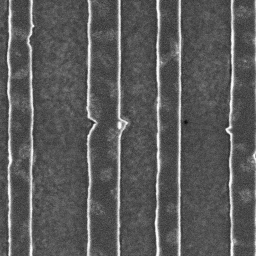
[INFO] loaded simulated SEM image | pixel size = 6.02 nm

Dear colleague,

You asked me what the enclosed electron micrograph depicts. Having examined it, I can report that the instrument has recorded one or a few lines or trenches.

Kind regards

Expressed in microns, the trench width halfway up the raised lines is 0.307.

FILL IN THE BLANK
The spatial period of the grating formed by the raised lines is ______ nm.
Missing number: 447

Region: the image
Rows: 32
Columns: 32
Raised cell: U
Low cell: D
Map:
DUUUDDDDDDDUUUUDDDDDUUDDDDDDDUUU
DUUUDDDDDDDUUUUDDDDDUUDDDDDDDUUU
DUUUDDDDDDDUUUUDDDDDUUDDDDDDDUUU
DUUUDDDDDDDUUUUDDDDDUUUDDDDDDUUU
DUUUDDDDDDDUUUUDDDDDUUUDDDDDDUUU
DUUUDDDDDDDUUUUDDDDDUUUDDDDDDUUU
DUUUDDDDDDDUUUUDDDDDUUUDDDDDDUUU
DUUUDDDDDDDUUUUDDDDDUUUDDDDDDUUU
DUUUDDDDDDDUUUUDDDDDUUUDDDDDDUUU
DUUUDDDDDDDUUUUDDDDDUUUDDDDDDUUU
DUUUDDDDDDDUUUUDDDDDUUUDDDDDDUUU
DUUUDDDDDDDUUUUDDDDDUUUDDDDDDUUU
DUUUDDDDDDDUUUUDDDDDUUUDDDDDDUUU
DUUUDDDDDDDUUUUDDDDDUUUDDDDDDUUU
DUUUDDDDDDDUUUUDDDDDUUUDDDDDDUUU
DUUUDDDDDDDDUUUUDDDDUUUDDDDDDUUU
DUUUDDDDDDDUUUUDDDDDUUUDDDDDUUUU
DUUUDDDDDDDUUUUDDDDDUUUDDDDDDUUU
DUUUDDDDDDDUUUUDDDDDUUUDDDDDDUUU
DUUUDDDDDDDUUUUDDDDDUUDDDDDDDUUU
DUUUDDDDDDDUUUUDDDDDUUDDDDDDDUUU
DUUUDDDDDDDUUUUDDDDDUUDDDDDDDUUU
DUUUDDDDDDDUUUUDDDDDUUDDDDDDDUUU
DUUUDDDDDDDUUUUDDDDDUUUDDDDDDUUU
DUUUDDDDDDDUUUUDDDDDUUUDDDDDDUUU
DUUUDDDDDDDUUUUDDDDDUUDDDDDDDUUU
DUUUDDDDDDDUUUUDDDDDUUDDDDDDDUUU
DUUUDDDDDDDUUUUDDDDUUUDDDDDDDUUU
DUUUDDDDDDDUUUUDDDDUUUDDDDDDDUUU
DUUUDDDDDDDUUUUDDDDDUUDDDDDDDUUU
DUUUDDDDDDDUUUUDDDDDUUDDDDDDDUUU
DUUUDDDDDDDUUUUDDDDDUUDDDDDDDUUU